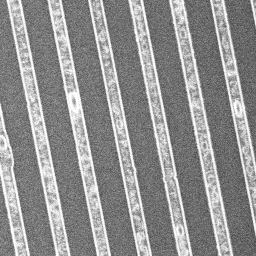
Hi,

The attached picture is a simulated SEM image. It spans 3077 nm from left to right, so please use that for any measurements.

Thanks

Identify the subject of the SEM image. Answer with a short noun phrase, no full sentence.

parallel lines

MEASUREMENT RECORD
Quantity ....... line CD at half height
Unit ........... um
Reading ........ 0.14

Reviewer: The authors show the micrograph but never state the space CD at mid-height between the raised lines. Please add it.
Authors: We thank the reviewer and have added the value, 336 nm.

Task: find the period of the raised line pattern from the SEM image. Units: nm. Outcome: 479